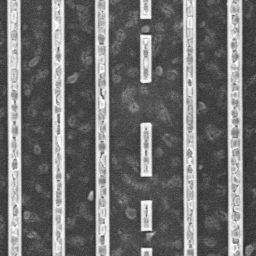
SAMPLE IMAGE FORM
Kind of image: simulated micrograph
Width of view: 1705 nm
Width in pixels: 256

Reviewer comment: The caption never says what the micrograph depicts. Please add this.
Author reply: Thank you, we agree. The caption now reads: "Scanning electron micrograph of parallel lines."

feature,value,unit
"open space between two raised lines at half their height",223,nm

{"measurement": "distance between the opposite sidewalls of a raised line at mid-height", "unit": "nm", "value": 70.8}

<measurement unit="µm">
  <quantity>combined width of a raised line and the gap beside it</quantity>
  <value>0.294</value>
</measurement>